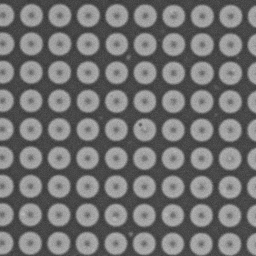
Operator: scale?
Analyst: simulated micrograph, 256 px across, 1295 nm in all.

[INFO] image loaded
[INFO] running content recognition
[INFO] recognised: an array of small figures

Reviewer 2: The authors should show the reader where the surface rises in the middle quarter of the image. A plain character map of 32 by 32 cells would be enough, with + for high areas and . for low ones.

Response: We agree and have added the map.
+...++++...++++...+++++..+++++..
++.++++++.++++++..+++++..+++++..
++.++++++.++++++..+++++..+++++..
+...++++...+++++..+++++..+++++..
.....++.....+++....+++....+++...
................................
................................
+...++++...++++...++++...++++...
++.++++++.++++++..+++++..+++++..
++.++++++.++++++..+++++..+++++..
+...++++...+++++..+++++..+++++..
....++++...++++...++++....+++...
................................
................................
+...++++...++++...++++...++++...
+..++++++.++++++..+++++..+++++..
+..++++++.++++++.++++++..+++++..
+..+++++...+++++..+++++..+++++..
+...++++...++++...++++...++++...
................................
................................
+...++++...++++...++++....+++...
+..+++++...+++++..+++++..+++++..
+..++++++.++++++.++++++..+++++..
+..++++++.++++++..+++++..+++++..
+...++++...++++...++++...++++...
................................
................................
+...++++...++++...++++....+++...
+..+++++...+++++..+++++..+++++..
+..++++++.++++++.++++++..+++++..
+..+++++..++++++.++++++..+++++..